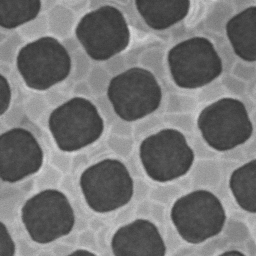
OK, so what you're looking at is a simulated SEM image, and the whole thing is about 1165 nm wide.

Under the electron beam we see a regular array of holes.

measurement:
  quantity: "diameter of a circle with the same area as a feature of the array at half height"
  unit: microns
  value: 0.241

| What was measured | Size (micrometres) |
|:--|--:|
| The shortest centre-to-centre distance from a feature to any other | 0.303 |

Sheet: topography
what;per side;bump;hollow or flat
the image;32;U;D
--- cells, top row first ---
DDDDDUUUUUUUUUUUUDDDDDDDUUUUUUUU
DDDDDUUUUUUDDDDUUDDDDDDUUUUUUUDD
DDDDUUUUUUDDDDDDUUDDDDDUUUUUUDDD
UDUUUUUUUUDDDDDDUUUDDUUUUUUUDDDD
UUUUUUUUUUDDDDDDUUUUUUUUUUUUDDDD
UUUUDDDDUUDDDDDDUUUUUUDDDDDUUDDD
UUDDDDDDUUUDDDDUUUUUUDDDDDDUUDDD
UUDDDDDDDUUUDUUUUUUUUDDDDDDDUUUD
UUDDDDDDDUUUUUUUDDUUUDDDDDDDUUUU
UUUDDDDDDUUUUUDDDDDUUDDDDDDUUUUU
DUUDDDDUUUUUUUDDDDDDUUDDDDUUUUUU
DUUUUUUUUUUUUDDDDDDDUUUUUUUUUUUU
DUUUUUUUUDDUUUDDDDDDUUUUUUUDDDUU
DUUUUUUDDDDDUUDDDDDDUUUUUUDDDDDU
UUUUUUDDDDDDDUUDDDUUUUUUUDDDDDDU
UUUUUUDDDDDDDUUUUUUUUUUUUDDDDDDU
UDDDUUDDDDDDDUUUUUUUDDDUUDDDDDDD
DDDDUUUDDDDDUUUUUUDDDDDUUUDDDDDU
DDDDDUUDDDUUUUUUUDDDDDDDUUUDDUUU
DDDDDUUUUUUUUUUUUDDDDDDDUUUUUUUU
DDDDDUUUUUUUDDDUUUDDDDDDUUUUUUUD
DDDDDUUUUUDDDDDDUUDDDDDUUUUUUDDD
DDUUUUUUUUDDDDDDDUUDDDUUUUUUUDDD
UUUUUUUUUUDDDDDDDUUUUUUUUUUUUDDD
UUUUDDDDUUDDDDDDDUUUUUUDDDDUUDDD
UUUDDDDDDUUDDDDDUUUUUUDDDDDDUUDD
UUUDDDDDDUUUDDUUUUUUUDDDDDDDUUUD
UUUDDDDDDUUUUUUUUDUUUUDDDDDDUUUU
DUUDDDDDDUUUUUUDDDDDUUDDDDDDUUUU
DUUUDDDDUUUUUUDDDDDDUUUDDDDUUUUU
DDUUUUUUUUUUUUDDDDDDDUUUUUUUUUUU
DDUUUUUUUDDUUUDDDDDDDUUUUUUUDDUU